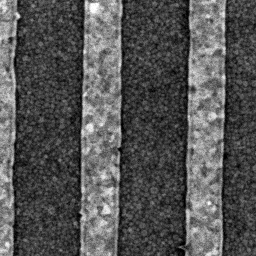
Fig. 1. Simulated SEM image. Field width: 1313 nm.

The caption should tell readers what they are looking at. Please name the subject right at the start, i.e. one or a few lines or trenches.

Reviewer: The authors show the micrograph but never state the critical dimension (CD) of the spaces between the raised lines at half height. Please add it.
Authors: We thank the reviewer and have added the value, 357 nanometres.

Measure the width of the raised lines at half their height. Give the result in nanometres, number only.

178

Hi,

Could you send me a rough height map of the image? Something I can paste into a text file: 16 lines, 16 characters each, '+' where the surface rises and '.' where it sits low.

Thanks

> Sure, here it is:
+....+++....++..
+....+++....++..
+....+++....++..
+....+++....++..
+....++.....++..
+....++.....++..
+....++.....++..
+....+++....++..
+....++.....++..
+....++.....++..
+....++.....++..
+....++.....++..
+....++.....++..
+....++.....++..
+....++.....++..
+....++.....++..